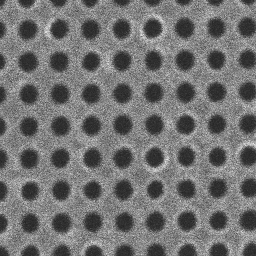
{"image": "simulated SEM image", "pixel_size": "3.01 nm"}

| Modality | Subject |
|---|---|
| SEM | a regular array of holes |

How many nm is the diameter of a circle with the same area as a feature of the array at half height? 59.2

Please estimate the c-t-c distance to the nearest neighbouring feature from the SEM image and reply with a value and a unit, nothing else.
93.8 nanometers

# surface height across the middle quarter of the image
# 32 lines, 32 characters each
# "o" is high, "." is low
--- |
.oooo....ooo.....ooo....oooo....
ooooo...ooooo...ooooo..oooooo..o
oooooooooooooooooooooooooooooooo
oooooooooooooooooooooooooooooooo
oooooooooooooooooooooooooooooooo
.oooo...ooooo...ooooo...ooooo...
.oooo....ooo.....ooo.....ooo....
.ooo.....ooo.....ooo.....ooo....
.ooo.....oooo....ooo.....ooo....
.oooo...ooooo...ooooo..oooooo...
oooooooooooooooooooooooooooooooo
oooooooooooooooooooooooooooooooo
oooooooooooooooooooooooooooooooo
ooooo....oooo...ooooo...ooooo...
.oooo....ooo.....ooo.....ooo....
..oo.....ooo.....ooo.....ooo....
.oooo....oooo....oooo....ooo....
.oooo...oooooo..ooooo...oooooo..
oooooooooooooooooooooooooooooooo
oooooooooooooooooooooooooooooooo
oooooooooooooooooooooooooooooooo
.ooooo..oooooo...oooo...ooooo...
.oooo....oooo....ooo.....ooo....
..ooo....ooo.....ooo.....ooo....
.oooo....ooo.....ooo.....ooo....
.oooo....oooo...ooooo...oooooo..
oooooooooooooooooooooooooooooooo
oooooooooooooooooooooooooooooooo
oooooooooooooooooooooooooooooooo
.ooooo...oooo....ooooo..ooooo...
.oooo....oooo....oooo....ooo....
..ooo.....oo......ooo....ooo....